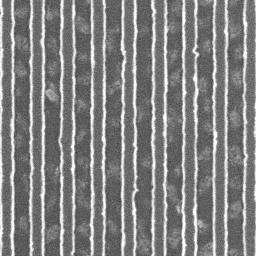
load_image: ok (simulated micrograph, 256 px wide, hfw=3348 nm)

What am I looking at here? parallel lines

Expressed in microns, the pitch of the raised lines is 0.399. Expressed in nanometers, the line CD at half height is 164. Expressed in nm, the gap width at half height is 239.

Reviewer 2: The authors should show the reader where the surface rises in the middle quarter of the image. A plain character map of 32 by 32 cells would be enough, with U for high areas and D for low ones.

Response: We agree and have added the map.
UUDDDDDUUUDDDDDUUUDDDDUUUDDDDDUU
UUDDDDDUUUDDDDDUUUDDDDUUUUDDDDUU
UUDDDDDUUUDDDDDUUUDDDDUUUUDDDDUU
UUDDDDDUUUDDDDDUUUDDDDUUUUDDDDUU
UUDDDDDUUUDDDDDUUUDDDDUUUUDDDDUU
UUDDDDDUUUDDDDDUUUDDDDUUUUDDDDUU
UUDDDDDUUUDDDDDUUUDDDDUUUUDDDDUU
UUDDDDDUUUDDDDDUUUDDDDUUUDDDDDUU
UUDDDDDUUUDDDDDUUUDDDDUUUDDDDDUU
UUDDDDDUUUDDDDDUUUDDDDUUUDDDDDUU
UUDDDDDUUUDDDDDUUUDDDDUUUDDDDDUU
UUDDDDDUUUDDDDDUUUDDDDUUUDDDDDUU
UUDDDDDUUUDDDDDUUUDDDDUUUDDDDDUU
UUDDDDDUUUDDDDDUUUDDDDUUUDDDDDUU
UUDDDDDUUUDDDDUUUUDDDDUUUDDDDDUU
UUDDDDDUUUDDDDDUUUDDDDUUUUDDDDUU
UUDDDDDUUUDDDDDUUUDDDDUUUDDDDDUU
UUDDDDDUUUDDDDDUUUDDDDUUUDDDDDUU
UUDDDDDUUUDDDDDUUUDDDDUUUDDDDDUU
UUDDDDDUUUDDDDDUUUDDDDUUUDDDDDUU
UUDDDDDUUUDDDDDUUUDDDDUUUDDDDDUU
UUDDDDDUUUDDDDDUUUDDDDUUUDDDDDUU
UUDDDDDUUUDDDDDUUUDDDDUUUUDDDDUU
UUDDDDDUUUDDDDDUUUDDDDUUUUDDDDUU
UUDDDDDUUUDDDDDUUUDDDDDUUDDDDDUU
UUDDDDDUUUDDDDUUUUDDDDDUUDDDDDUU
UUDDDDDUUUDDDDDUUUDDDDUUUUDDDDUU
UUDDDDDUUUDDDDDUUUDDDDUUUDDDDDUU
UUDDDDDUUUDDDDDUUUDDDDUUUDDDDDUU
UUDDDDDUUUDDDDDUUUDDDDDUUDDDDDUU
UUDDDDDUUUDDDDDUUUDDDDDUUDDDDDUU
UUUDDDDUUUDDDDDUUUDDDDUUUDDDDDUU